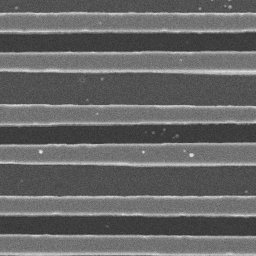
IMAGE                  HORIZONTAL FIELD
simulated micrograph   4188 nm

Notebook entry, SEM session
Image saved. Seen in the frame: lines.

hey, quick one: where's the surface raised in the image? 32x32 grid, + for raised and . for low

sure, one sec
................................
................................
++++++++++++++++++++++++++++++++
++++++++++++++++++++++++++++++++
................................
................................
................................
++++++++++++++++++++++++++++++++
++++++++++++++++++++++++++++++++
................................
................................
................................
................................
++++++++++++++++++++++++++++++++
++++++++++++++++++++++++++++++++
++++++++++++++..................
................................
................................
++++++++++++++++++++++++++++++++
++++++++++++++++++++++++++++++++
..........................+.....
................................
................................
................................
................................
++++++++++++++++++++++++++++++++
++++++++++++++++++++++++++++++++
................................
................................
++++++++.+++....................
++++++++++++++++++++++++++++++++
++++++++++++++++++++++++++++++++